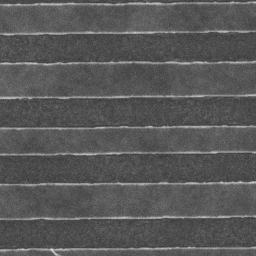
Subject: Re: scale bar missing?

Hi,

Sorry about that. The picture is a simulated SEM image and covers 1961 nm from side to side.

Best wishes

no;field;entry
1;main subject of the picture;lines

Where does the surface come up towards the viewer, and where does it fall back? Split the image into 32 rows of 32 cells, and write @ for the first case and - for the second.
--------@@------@@@@-@@@@@@@@@@@
@@@@@@@@@@@@@@@@@@@@@@@@@@@@@@@@
@@@@@@@@@@@@@@@@@@@@@@@@@@@@@@@@
@@@@@@@@@@@@@@@@@@@@@@@@@@@@@@@@
--------------------------------
--------------------------------
--------------------------------
--------------------------------
@@@@@@@@@@@@@@@@@@@@@@@@@@@@@@@@
@@@@@@@@@@@@@@@@@@@@@@@@@@@@@@@@
@@@@@@@@@@@@@@@@@@@@@@@@@@@@@@@@
@@@@@@@@@@@@@@@@@@@@@@@@@@@@@@@@
--------------------------------
--------------------------------
--------------------------------
--------------------------------
@@@@@@@@@@@@@@@@@@@@@@@@@@@@@@@@
@@@@@@@@@@@@@@@@@@@@@@@@@@@@@@@@
@@@@@@@@@@@@@@@@@@@@@@@@@@@@@@@@
--------------------------------
--------------------------------
--------------------------------
--------------------------------
@@@@@@@@@@@@@@@@@@@@@@@@@@@@@@@@
@@@@@@@@@@@@@@@@@@@@@@@@@@@@@@@@
@@@@@@@@@@@@@@@@@@@@@@@@@@@@@@@@
@@@@@@@@@@@@@@@@@@@@@@@@@@@@@@@@
--------------------------------
--------------------------------
--------------------------------
--------------------------------
@@@@@@@@@@@@@@@@@@@@@@@@@@@@@@@@